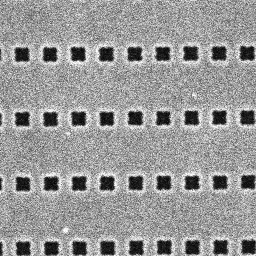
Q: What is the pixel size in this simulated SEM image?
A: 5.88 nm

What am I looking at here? a regular array of holes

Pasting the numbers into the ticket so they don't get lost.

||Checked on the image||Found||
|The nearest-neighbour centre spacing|164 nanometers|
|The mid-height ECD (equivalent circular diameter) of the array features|96.8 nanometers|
